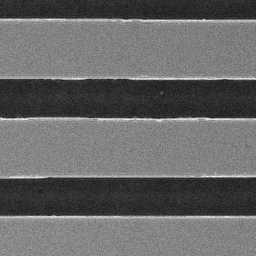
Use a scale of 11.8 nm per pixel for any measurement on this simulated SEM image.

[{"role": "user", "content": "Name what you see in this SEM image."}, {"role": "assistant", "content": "lines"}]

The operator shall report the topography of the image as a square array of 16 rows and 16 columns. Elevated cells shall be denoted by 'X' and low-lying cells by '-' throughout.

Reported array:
----------------
XXXXXXXXXXXXXXXX
XXXXXXXXXXXXXXXX
XXXXXXXXXXXXXXXX
XXXXXXXXXXXXXXXX
----------------
----------------
XXXXXXXXXXXXXXXX
XXXXXXXXXXXXXXXX
XXXXXXXXXXXXXXXX
XXXXXXXXXXXXXXXX
----------------
----------------
----------------
XXXXXXXXXXXXXXXX
XXXXXXXXXXXXXXXX